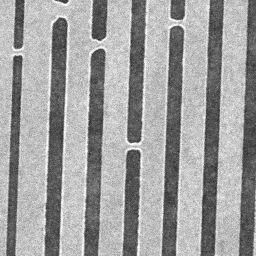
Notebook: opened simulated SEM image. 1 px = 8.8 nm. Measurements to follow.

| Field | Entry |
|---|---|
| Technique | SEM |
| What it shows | parallel lines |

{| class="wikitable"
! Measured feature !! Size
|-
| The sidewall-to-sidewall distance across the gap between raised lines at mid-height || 136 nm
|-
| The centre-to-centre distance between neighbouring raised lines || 346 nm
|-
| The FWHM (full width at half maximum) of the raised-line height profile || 209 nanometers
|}